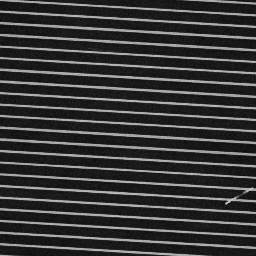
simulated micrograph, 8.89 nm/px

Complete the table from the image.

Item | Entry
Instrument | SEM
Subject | parallel lines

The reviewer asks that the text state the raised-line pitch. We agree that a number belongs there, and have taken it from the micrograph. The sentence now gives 103 nm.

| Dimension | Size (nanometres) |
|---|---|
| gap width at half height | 84.3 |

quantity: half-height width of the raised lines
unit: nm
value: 16.6